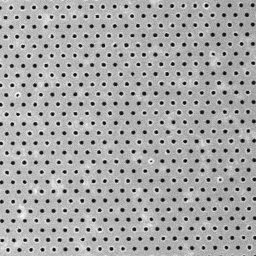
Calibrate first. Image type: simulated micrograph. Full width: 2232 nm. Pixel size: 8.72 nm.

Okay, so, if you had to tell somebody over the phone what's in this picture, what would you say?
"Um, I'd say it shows a regular array of holes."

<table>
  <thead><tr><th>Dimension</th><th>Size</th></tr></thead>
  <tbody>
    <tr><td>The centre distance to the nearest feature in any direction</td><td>96.5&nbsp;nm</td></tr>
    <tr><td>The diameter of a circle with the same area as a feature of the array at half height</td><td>34.1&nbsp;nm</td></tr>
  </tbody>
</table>